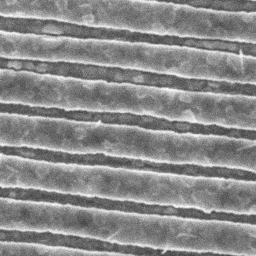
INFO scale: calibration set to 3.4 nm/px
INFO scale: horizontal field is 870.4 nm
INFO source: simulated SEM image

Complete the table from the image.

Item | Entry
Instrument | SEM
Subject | parallel lines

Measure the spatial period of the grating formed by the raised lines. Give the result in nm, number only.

145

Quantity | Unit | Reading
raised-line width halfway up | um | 0.105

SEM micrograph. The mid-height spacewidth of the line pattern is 40.1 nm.